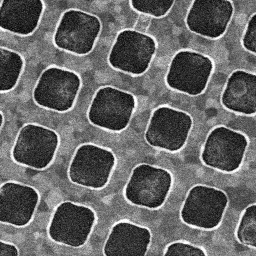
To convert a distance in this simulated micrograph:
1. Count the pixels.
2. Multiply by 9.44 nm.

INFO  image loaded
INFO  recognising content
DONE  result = a regular array of holes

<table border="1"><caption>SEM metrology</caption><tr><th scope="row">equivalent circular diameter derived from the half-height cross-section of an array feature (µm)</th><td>0.42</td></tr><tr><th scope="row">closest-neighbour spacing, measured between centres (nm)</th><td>562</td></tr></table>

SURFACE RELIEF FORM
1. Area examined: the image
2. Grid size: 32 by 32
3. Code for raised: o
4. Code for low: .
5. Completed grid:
.....ooooooooooo......oo.....ooo
.....ooo..ooooooo....ooo.....ooo
.....ooo....ooooo..oooo......oo.
....ooo......oooo.oooooo....ooo.
ooooooo.....ooo....ooooooo..ooo.
ooooooo.....oo.....ooooooooooo..
..ooooooo..ooo.....ooo..oooooooo
...ooooooooooo.....ooo....oooooo
...ooo..oooooo....ooo......ooooo
..ooo.....ooooooooooo.....ooo...
..ooo.....ooooooooooo.....oo....
oooo......oo....ooooooo..ooo....
oooo.....ooo.....ooooooooooo....
oooooo...oo......ooo.ooooooo....
ooooooooooo.....ooo.....oooooooo
oooooooooooo....ooo.....oooooooo
oo.....ooooooooooo......oo....oo
oo.....ooooooooooo.....ooo.....o
oo.....ooo...ooooooo...oo......o
oo.....oo.....ooooooooooo.....oo
ooo...ooo.....oooooooooooo....oo
ooooooooo.....ooo....ooooooooooo
ooooooooo.....oo.....ooooooooooo
....oooooooooooo.....ooo...ooooo
.....ooooooooooo.....oo.....oooo
.....ooo..ooooooo...ooo.....oooo
....ooo.....ooooooooooo.....ooo.
....oo......ooooooooooo.....oo..
oooooo......oo....ooooooo..ooo..
oooooo.....ooo.....ooooooooooo..
.ooooooo..ooo......oo...ooooooo.
..ooooooooooo.....ooo....ooooooo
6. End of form